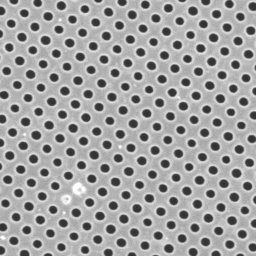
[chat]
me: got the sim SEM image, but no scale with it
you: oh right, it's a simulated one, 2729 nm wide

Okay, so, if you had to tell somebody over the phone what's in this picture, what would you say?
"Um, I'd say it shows a regular array of holes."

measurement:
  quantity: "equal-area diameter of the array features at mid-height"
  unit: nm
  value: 94.7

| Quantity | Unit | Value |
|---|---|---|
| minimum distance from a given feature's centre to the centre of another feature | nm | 176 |